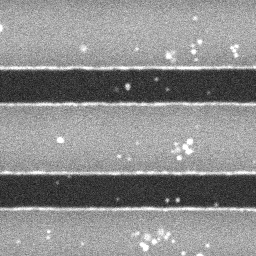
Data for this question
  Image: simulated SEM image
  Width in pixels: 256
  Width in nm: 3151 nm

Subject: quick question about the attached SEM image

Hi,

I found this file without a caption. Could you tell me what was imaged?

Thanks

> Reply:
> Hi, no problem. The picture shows lines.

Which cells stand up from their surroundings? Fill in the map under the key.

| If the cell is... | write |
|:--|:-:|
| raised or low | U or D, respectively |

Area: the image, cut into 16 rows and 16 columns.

DDDDDDDDDDDDDDDD
DDDDDDDDDDDDDDDD
DDDDDDDDDDDDDDDD
DDDDDDDDDDDDDDDD
UUUUUUUUUUUUUUUU
UUUUUUUUUUUUUUUU
UUUUUUUUUUUUUDUU
DDDDDDDDDDDDDDDD
DDDDDDDDDDDDDDDD
DDDDDDDDDDDDDDDD
DDDDDDDDDDDDDDDD
UUUUUUUUUUUUUUUU
UUUUUUUUUUUUUUUU
DDDDDDDDDDDDDDDD
DDDDDDDDDDDDDDDD
DDDDDDDDDDDDDDDD